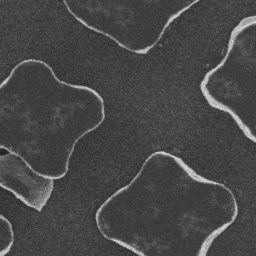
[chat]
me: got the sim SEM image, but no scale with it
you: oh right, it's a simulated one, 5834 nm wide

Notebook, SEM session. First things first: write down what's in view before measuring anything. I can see raised bodies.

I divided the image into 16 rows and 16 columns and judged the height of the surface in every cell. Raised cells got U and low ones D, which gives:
DDDDUUUUUUUUDDDD
DDDDDUUUUUUDDDDU
DDDDDDDUUUDDDDUU
DDDDDDDDDDDDDDUU
DUUDDDDDDDDDDUUU
UUUUUDDDDDDDDUUU
UUUUUUDDDDDDDUUU
UUUUUUDDDDDDDDDU
UUUUUDDDDDDDDDDD
UUUUDDDDDDDDDDDD
UUUUDDDDDUUUDDDD
UUUDDDDDUUUUUUDD
DUUDDDDUUUUUUUUD
DDDDDDUUUUUUUUUD
UDDDDDUUUUUUUUDD
DDDDDDDDUUUUUDDD